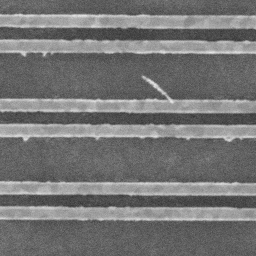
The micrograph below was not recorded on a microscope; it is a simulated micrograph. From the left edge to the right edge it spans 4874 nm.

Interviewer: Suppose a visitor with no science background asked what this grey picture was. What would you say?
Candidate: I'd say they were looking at lines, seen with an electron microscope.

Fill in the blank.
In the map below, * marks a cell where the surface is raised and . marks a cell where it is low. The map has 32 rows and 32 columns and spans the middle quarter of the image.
................................
................................
................................
................................
................................
................................
................................
................................
................................
********************************
********************************
********************************
................................
................................
................................
********************************
********************************
********************************
................................
................................
................................
................................
................................
................................
................................
................................
................................
................................
................................
................................
********************************
********************************